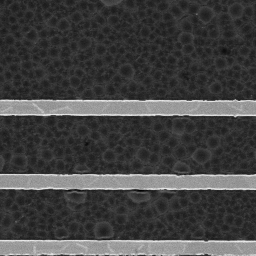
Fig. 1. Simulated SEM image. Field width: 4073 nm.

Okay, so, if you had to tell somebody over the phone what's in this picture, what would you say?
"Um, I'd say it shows one or a few lines or trenches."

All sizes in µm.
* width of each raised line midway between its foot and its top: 0.217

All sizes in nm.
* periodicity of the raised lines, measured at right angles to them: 1130